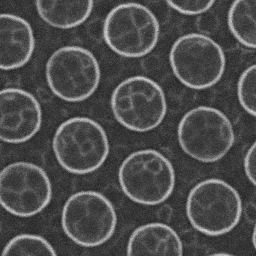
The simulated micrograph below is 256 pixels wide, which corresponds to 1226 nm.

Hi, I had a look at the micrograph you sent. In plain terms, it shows a regular array of raised bodies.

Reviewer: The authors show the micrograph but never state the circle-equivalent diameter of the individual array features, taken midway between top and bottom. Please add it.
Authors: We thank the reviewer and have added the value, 256 nm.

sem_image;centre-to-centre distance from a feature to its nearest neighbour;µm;0.345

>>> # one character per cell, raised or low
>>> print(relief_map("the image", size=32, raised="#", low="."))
.....######..........#####...###
.....######...#####....##....###
###...####...######..........###
####.........#######.........###
####.........#######....#....###
####..........#####...#####....#
####...####....###...#######....
###...######.........#######....
#.....######..........######...#
......######..........#####...##
......######...####....###....##
###....#####..######..........##
####....##....#######.........##
#####.........#######....#.....#
#####..........#####...#####....
#####...####....####...######...
####...######.........#######...
.##....######..........######...
.......######..........######..#
.......######...####....####...#
..#.....#####..######..........#
#####....##....#######.........#
######.........#######.........#
######.........#######..#####...
######...####...#####...######..
######..######..........######..
.####...######.........#######..
........######..........######..
........######....###....####...
...#.....#####...#####..........
.#####....##....#######.........
.######.........#######.........